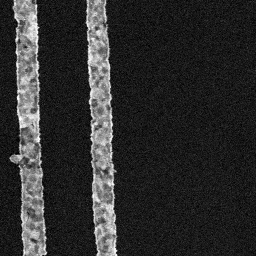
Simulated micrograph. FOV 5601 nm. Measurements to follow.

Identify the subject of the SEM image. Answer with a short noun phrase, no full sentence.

one or a few lines or trenches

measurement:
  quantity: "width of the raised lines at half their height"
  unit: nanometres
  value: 426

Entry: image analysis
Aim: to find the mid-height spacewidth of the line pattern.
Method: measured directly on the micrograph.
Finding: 1130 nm